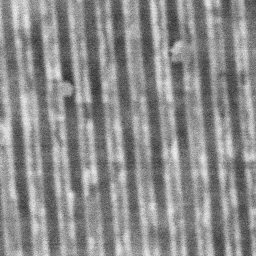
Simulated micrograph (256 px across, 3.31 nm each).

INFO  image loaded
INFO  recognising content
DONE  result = parallel lines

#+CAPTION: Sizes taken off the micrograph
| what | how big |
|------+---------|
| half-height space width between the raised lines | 42.5 nanometres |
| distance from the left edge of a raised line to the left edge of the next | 90.1 nm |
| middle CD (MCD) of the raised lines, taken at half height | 45.4 nm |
